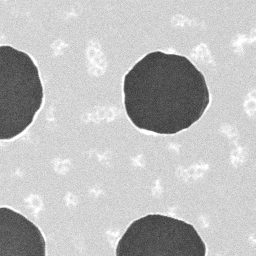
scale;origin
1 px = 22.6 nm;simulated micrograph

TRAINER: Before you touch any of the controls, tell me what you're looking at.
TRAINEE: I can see holes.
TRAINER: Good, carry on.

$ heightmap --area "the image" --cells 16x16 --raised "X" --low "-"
XXXXXXXXXXXXXXXX
XXXXXXXXXXXXXXXX
XXXXXXXXXXXXXXXX
--XXXXXXX--XXXXX
--XXXXXX-----XXX
---XXXXX-----XXX
---XXXXX-----XXX
--XXXXXX----XXXX
-XXXXXXXXXXXXXXX
XXXXXXXXXXXXXXXX
XXXXXXXXXXXXXXXX
XXXXXXXXXXXXXXXX
XXXXXXXXXXXXXXXX
--XXXXXXX-XXXXXX
---XXXXX----XXXX
---XXXX------XXX